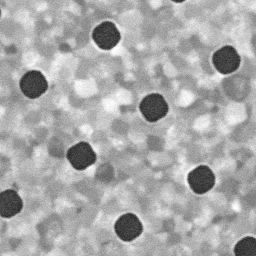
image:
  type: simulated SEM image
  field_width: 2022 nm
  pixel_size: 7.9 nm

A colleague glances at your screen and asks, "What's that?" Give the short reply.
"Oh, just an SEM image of holes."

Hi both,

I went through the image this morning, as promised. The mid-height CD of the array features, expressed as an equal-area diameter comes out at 235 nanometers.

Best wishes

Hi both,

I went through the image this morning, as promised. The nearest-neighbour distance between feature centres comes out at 679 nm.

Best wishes